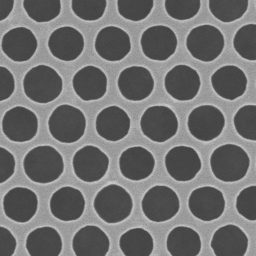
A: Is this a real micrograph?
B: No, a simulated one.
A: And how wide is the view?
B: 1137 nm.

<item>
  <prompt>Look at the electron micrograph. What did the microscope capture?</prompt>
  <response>a regular array of holes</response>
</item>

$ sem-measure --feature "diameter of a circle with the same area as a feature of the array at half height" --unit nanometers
159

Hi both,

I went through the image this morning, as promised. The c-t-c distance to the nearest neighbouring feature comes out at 45.9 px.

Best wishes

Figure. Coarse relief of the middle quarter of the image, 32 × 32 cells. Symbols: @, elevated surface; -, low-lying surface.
@@@@@---@@@@@@@@@--@@@@@@@@@---@
@@@@-----@@@@@@------@@@@@@-----
@@@-------@@@@--------@@@@------
@@---------@@@--------@@@-------
@@---------@@---------@@@-------
@@---------@@---------@@@-------
@@@--------@@@--------@@@-------
@@@-------@@@@-------@@@@@------
@@@@-----@@@@@@------@@@@@@-----
@@@@@@@@@@@@@@@@@@@@@@@@@@@@@@@@
--@@@@@@@@@@-@@@@@@@@@---@@@@@@@
----@@@@@@-----@@@@@-------@@@@@
-----@@@@-------@@@@--------@@@@
-----@@@--------@@@---------@@@-
------@@---------@@----------@@-
------@@---------@@----------@@-
-----@@@--------@@@---------@@@-
-----@@@@-------@@@@--------@@@@
----@@@@@@-----@@@@@@-----@@@@@@
---@@@@@@@@@@@@@@@@@@@@--@@@@@@@
@@@@@--@@@@@@@@@@@@@@@@@@@@@@-@@
@@@@-----@@@@@@------@@@@@@-----
@@@-------@@@@--------@@@@------
@@---------@@@---------@@-------
@@---------@@@---------@@-------
@@---------@@@---------@@-------
@@@--------@@@--------@@@@------
@@@-------@@@@@-------@@@@------
@@@@-----@@@@@@@----@@@@@@@-----
@@@@@@-@@@@@@@@@@@@@@@@@@@@@@@@@
@@@@@@@@@@@---@@@@@@@@@--@@@@@@@
---@@@@@@-------@@@@@------@@@@@